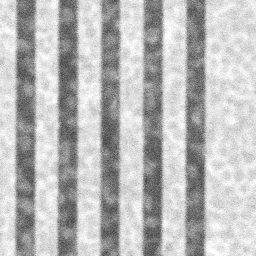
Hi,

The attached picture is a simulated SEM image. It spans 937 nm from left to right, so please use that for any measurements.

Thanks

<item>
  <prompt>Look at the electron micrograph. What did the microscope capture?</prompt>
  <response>parallel lines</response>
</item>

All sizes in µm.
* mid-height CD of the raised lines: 0.08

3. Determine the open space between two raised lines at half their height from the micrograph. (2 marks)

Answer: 0.0768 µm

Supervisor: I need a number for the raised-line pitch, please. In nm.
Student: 155